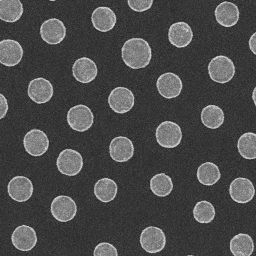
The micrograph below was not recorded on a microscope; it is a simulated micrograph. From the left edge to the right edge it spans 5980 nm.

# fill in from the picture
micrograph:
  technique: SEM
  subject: a regular array of raised bodies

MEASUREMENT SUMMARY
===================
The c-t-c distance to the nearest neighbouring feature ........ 1100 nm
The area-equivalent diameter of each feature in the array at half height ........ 572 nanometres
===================